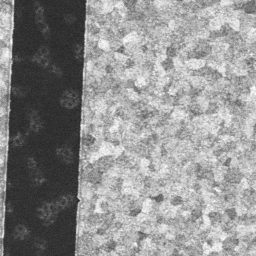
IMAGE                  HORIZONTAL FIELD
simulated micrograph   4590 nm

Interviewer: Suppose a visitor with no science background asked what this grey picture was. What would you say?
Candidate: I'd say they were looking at one or a few lines or trenches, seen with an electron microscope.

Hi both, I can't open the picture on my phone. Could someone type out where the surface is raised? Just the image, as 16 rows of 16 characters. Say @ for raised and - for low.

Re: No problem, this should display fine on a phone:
@----@@@@@@@@@@@
@----@@@@@@@@@@@
@----@@@@@@@@@@@
@----@@@@@@@@@@@
@----@@@@@@@@@@@
@----@@@@@@@@@@@
@----@@@@@@@@@@@
@----@@@@@@@@@@@
@----@@@@@@@@@@@
-----@@@@@@@@@@@
-----@@@@@@@@@@@
-----@@@@@@@@@@@
-----@@@@@@@@@@@
-----@@@@@@@@@@@
-----@@@@@@@@@@@
-----@@@@@@@@@@@